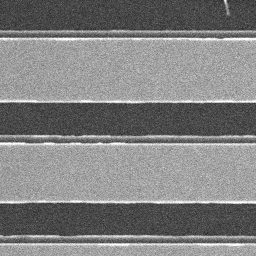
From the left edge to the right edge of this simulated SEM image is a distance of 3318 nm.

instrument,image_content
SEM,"lines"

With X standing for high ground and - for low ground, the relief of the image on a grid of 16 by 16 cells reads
----------------
----------------
XXXXXXXXXXXXXXXX
XXXXXXXXXXXXXXXX
XXXXXXXXXXXXXXXX
XXXXXXXXXXXXXXXX
----------------
----------------
----------------
XXXXXXXXXXXXXXXX
XXXXXXXXXXXXXXXX
XXXXXXXXXXXXXXXX
XXXXXXXXXXXXXXXX
----------------
----------------
XXXXXXXXXXXXXXXX